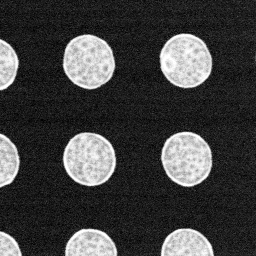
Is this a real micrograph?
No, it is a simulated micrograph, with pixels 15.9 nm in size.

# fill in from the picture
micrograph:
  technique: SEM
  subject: raised bodies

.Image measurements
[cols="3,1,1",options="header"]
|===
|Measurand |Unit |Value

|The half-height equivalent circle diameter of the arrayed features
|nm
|811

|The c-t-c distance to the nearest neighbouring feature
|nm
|1550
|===